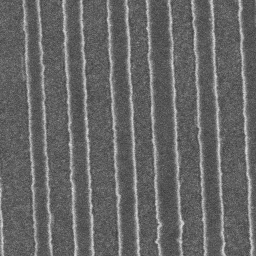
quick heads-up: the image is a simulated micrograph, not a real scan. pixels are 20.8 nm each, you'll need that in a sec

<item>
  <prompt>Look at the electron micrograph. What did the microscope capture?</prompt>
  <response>parallel lines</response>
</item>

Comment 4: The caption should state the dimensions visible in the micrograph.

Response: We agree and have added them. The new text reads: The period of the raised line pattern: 0.886 microns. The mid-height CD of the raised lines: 407 nm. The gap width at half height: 484 nanometers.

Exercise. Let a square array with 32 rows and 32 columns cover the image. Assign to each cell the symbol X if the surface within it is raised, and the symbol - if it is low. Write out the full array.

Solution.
---XX---XX---XXX--XXX---XXX---XX
---XX---XX---XXX--XXX---XXX---XX
---XX---XX---XXX---XX---XXX---XX
---XX---XX----XX--XXX---XXX---XX
---XX---XX----XX---XXX--XXX---XX
---XX---XX----XX---XXX--XXX---XX
---XX---XX----XX---XXX--XXX---XX
---XX---XXX---XX---XXX--XXX---XX
---XX---XXX---XX---XXX---XX---XX
---XX---XXX---XX---XXX--XXX---XX
---XX---XXX---XX---XXX---XX---XX
---XXX--XXX---XX---XXX---XX----X
---XXX--XXX---XX---XXX---XX----X
----XX--XXX---XXX--XXX---XX----X
----XX--XXX---XXX--XXX---XX----X
----XX---XX---XXX--XXX---XX----X
----XX---XX---XXX--XXX---XX----X
----XX---XX---XXX--XXX---XX----X
----XX---XX---XXX--XXX---XX----X
----XX---XX---XXX--XXX---XX----X
----XX---XX---XXX--XXX---XX----X
----XX---XX---XXX--XXX---XXX---X
----XX---XX---XXX--XXX---XXX---X
----XX---XX----XX--XXX---XXX---X
----XX---XX----XX--XXX---XXX---X
----XX---XX----XX---XX---XXX---X
----XX---XX----XX---XXX--XXX---X
----XX---XXX---XX---XXX--XXX---X
----XX---XXX---XX---XXX---XX---X
----XX---XXX---XX---XXX---XX---X
----XX---XXX---XX---XXX---XX---X
----XXX--XXX---XX---XXX---XX---X